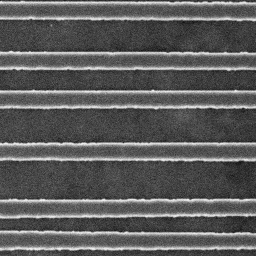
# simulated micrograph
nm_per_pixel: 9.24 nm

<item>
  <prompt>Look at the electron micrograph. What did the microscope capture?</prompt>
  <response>lines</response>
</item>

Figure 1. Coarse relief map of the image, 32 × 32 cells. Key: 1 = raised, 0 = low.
11111111111111111111111111111111
11111111111111111111111111111111
00000000000000000000000000000111
00000000000000000000000000000000
00000000000000000000000000000000
00000000000000000000000000000000
11110000000000000000000000000000
11111111111111111111111111111111
11111111111111111111111111111111
00000000000000000000000000000000
00000000000000000000000000000000
11111111111111111111111111111111
11111111111111111111111111111111
00000000000000000000000000000000
00000000000000000000000000000000
00000000000000000000000000000000
00000000000000000000000000000000
00000000000000000000000000000000
11111111111111111111111111111111
11111111111111111111111111111111
00000000000000000000000000000000
00000000000000000000000000000000
00000000000000000000000000000000
00000000000000000000000000000000
00000000000000000000000000000000
11111111111111111111111111111111
11111111111111111111111111111111
00000000000000000000000000000000
00000000000000000000000000000000
11111111111111111111111111111111
11111111111111111111111111111111
00000000000000000000000000000000